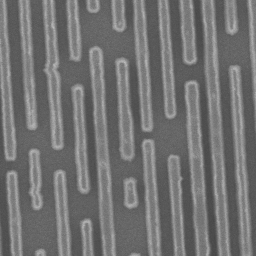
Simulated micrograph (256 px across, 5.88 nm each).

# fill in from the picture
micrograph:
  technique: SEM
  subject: parallel lines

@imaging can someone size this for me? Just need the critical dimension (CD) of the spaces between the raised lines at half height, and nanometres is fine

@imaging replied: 74.1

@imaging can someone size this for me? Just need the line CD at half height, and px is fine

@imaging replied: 10.7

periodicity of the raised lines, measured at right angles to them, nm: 135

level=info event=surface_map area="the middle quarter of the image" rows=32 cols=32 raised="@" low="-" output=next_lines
-------@@@---@@@--@@@----@@-----
-------@@@---@@@---@@----@@-----
-------@@@---@@@---@@----@@-----
-------@@@----@@---@@----@@-----
-------@@@---@@@---@@----@@----@
-------@@@---@@@---@@----@@---@@
--@@@--@@@----@@---@@@---@@----@
--@@@--@@@----@@---@@----@@---@@
--@@@--@@@----@@---@@----@@@--@@
---@@--@@@----@@---@@@---@@@---@
---@@--@@@----@@---@@@---@@@---@
---@@---@@----@@@--@@@---@@@---@
---@@---@@----@@@--@@@----@@---@
---@@---@@----@@@---@@---------@
---@@---@@----@@@--@@@---------@
---@@---@@----@@@--@@@---------@
---@@---@@@---@@@---@----------@
---@@---@@@---@@@--------------@
---@@@--@@@---@@@--------------@
---@@---@@@---@@@---@@---------@
---@@---@@@---@@@---@@---------@
---@@@--@@@---@@@---@@---------@
---@@@--@@@----@@---@@----------
---@@@--@@@-----@---@@----@@----
---@@@--@@@---------@@----@@@---
---@@@--@@@---------@@@---@@@---
----@@--@@@---------@@@---@@@---
----@@---@@---------@@@---@@@---
----@@---@@@--------@@@---@@@---
----@@---@@@---@@@--@@@---@@@---
----@@---@@@---@@@--@@@---@@@---
----@@---@@@---@@@--@@@----@@---